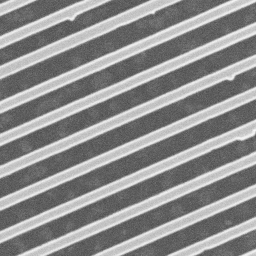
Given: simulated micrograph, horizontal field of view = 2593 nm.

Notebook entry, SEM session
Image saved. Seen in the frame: parallel lines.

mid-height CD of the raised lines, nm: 98.7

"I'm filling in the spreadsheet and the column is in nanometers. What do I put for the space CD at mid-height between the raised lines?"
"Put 205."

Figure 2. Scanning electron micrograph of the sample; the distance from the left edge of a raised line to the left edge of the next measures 29.8 pixels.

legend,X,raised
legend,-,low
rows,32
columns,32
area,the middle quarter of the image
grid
-----XXXXXX------------XXXXXX---
--XXXXXXX------------XXXXXX-----
XXXXXXX------------XXXXXX-------
XXXX-------------XXXXX----------
XX------------XXXXXX------------
------------XXXXXX------------XX
----------XXXXXX------------XXXX
-------XXXXXX-------------XXXXX-
-----XXXXXX------------XXXXXXX--
---XXXXXX------------XXXXXX-----
-XXXXX-------------XXXXXX-------
XXXX------------XXXXXXX---------
XX------------XXXXXX------------
------------XXXXXX-------------X
----------XXXXX-------------XXXX
-------XXXXXX-------------XXXXXX
-----XXXXXX-------------XXXXXX--
---XXXXXX------------XXXXXX-----
XXXXXXX------------XXXXXX-------
XXXXX------------XXXXXX---------
XX-------------XXXXX------------
------------XXXXXX-------------X
----------XXXXXX-------------XXX
--------XXXXXX-------------XXXXX
-----XXXXXX-------------XXXXXX--
---XXXXXX-------------XXXXXX----
-XXXXXX-------------XXXXXX------
XXXX-------------XXXXXX---------
XX-------------XXXXXX-----------
-------------XXXXXX------------X
----------XXXXXX-------------XXX
--------XXXXXX------------XXXXXX